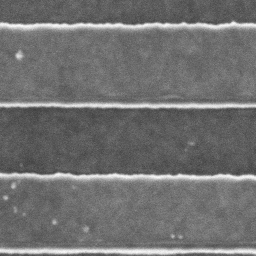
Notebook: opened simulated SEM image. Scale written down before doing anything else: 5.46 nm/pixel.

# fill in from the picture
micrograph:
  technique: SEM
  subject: lines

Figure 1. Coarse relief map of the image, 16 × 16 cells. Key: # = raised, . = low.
................
................
################
################
################
################
################
................
................
................
................
################
################
################
################
################